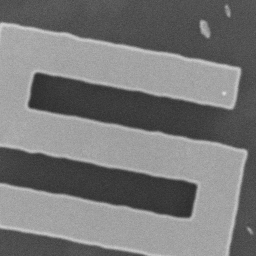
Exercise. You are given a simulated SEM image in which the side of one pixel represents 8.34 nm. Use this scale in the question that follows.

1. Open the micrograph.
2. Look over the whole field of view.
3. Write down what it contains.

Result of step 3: groups of lines, slits or small figures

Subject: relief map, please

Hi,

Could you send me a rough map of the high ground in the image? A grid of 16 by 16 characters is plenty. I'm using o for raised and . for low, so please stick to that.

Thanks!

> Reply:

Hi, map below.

................
o...............
oooooo..........
ooooooooooo.....
ooooooooooooooo.
oo......ooooooo.
oo...........oo.
oooooo..........
ooooooooooo.....
..ooooooooooooo.
.......oooooooo.
............ooo.
oooooo......ooo.
ooooooooooo.ooo.
..oooooooooooo..
.......ooooooo..